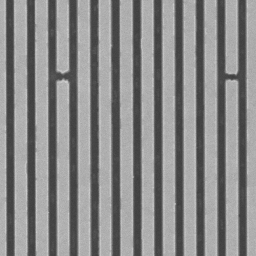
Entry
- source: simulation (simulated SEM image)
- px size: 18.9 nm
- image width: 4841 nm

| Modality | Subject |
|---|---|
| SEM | parallel lines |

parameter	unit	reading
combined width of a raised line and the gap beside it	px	21.1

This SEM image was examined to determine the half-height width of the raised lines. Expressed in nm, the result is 246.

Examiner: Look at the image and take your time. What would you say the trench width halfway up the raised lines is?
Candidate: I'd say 166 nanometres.